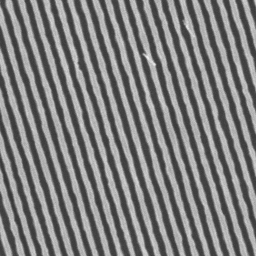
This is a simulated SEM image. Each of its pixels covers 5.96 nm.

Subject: parallel lines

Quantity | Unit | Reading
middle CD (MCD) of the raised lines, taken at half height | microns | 0.0314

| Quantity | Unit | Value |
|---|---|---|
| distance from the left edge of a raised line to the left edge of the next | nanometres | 71.1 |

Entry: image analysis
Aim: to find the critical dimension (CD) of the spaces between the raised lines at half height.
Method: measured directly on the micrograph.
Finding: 41.5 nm